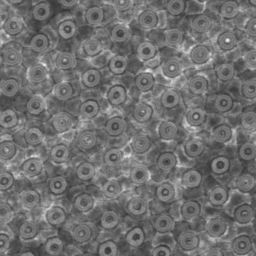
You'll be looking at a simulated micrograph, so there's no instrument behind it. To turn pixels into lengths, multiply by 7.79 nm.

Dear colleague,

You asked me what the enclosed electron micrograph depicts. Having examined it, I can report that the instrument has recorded a regular array of ring-shaped raised bodies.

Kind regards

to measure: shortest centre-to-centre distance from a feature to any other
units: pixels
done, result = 15.2